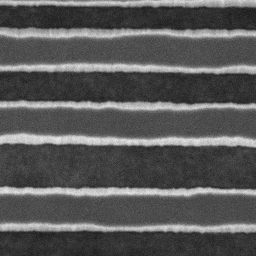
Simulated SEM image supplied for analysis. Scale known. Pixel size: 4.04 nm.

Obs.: lines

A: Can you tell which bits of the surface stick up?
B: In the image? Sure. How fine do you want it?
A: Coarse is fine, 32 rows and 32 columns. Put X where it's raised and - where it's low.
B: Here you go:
--------XXXX--XXXX-X---XX-------
--------------------------------
--------------------------------
--------------------------------
XXXXXXXXXXXXXXXXXXXXXXXXXXXXXXXX
XXXXXXXXXXXXXXXXXXXXXXXXXXXXXXXX
XXXXXXXXXXXXXXXXXXXXXXXXXXXXXXXX
XXXXXXXXXXXXXXXXXXXXXXXXXXXXXXXX
XXXXXXXX-XXXXXXXXXXXXXXXXXXXXXXX
--------------------------------
--------------------------------
--------------------------------
--------------------------------
XXXXXXXXXXXXXXXXXXXXXXXXXXXXXXXX
XXXXXXXXXXXXXXXXXXXXXXXXXXXXXXXX
XXXXXXXXXXXXXXXXXXXXXXXXXXXXXXXX
XXXXXXXXXXXXXXXXXXXXXXXXXXXXXXXX
X---XXXXXXXXXXXXXXXXXXXXXXXXXXXX
--------------------------------
--------------------------------
--------------------------------
--------------------------------
--------------------------------
--------------------------------
XXXXXXXXXXXXXXXXXXXXXXXXXXXXXXXX
XXXXXXXXXXXXXXXXXXXXXXXXXXXXXXXX
XXXXXXXXXXXXXXXXXXXXXXXXXXXXXXXX
XXXXXXXXXXXXXXXXXXXXXXXXXXXXXXXX
X--X--XXXX-XXXXXXXXXXXXXXXXXXXXX
--------------------------------
--------------------------------
--------------------------------